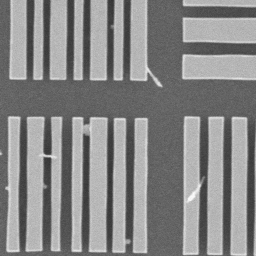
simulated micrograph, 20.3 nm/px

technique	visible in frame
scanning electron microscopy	groups of lines, slits or small figures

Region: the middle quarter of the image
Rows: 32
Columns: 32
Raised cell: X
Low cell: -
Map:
---X---XXX---XX--XXXX---------XX
---X---XXX---XX--XXXX---------XX
---X---XXX---XX--XXX----------XX
---X---XXX---X---XXX----------XX
--------------------------------
--------------------------------
--------------------------------
--------------------------------
--------------------------------
--------------------------------
--------------------------------
--------------------------------
--------------------------------
------------------------------XX
--XXX--XXXX--XX---XXX---------XX
--XXX--XXXX--XX---XXX---------XX
--XXX--XXXX--XX---XXX---------XX
--XXX--XXXX--XX---XXX---------XX
--XXX--XXXX--XX---XXX---------XX
--XXX--XXXX--XX---XXX---------XX
--XXX--XXXX--XX---XX----------XX
--XXX--XXXX--XX---XX----------XX
--XXX-XXXXX--XX---XX----------XX
--XXX-XXXXX--XX---XX----------XX
--XX--XXXXX--XX---XX----------XX
--XX--XXXXX--XX---XXX---------XX
--XX--XXXXX--XX---XXX---------XX
--XX--XXXXX-XXX---XX----------XX
--XX--XXXXX-XXX---XX----------XX
--XX--XXXXX-XXX---XX----------XX
--XX--XXXXX-XXX---XX----------XX
--XX--XXXXX-XXX---XX----------XX